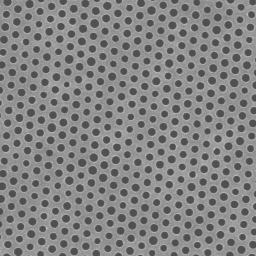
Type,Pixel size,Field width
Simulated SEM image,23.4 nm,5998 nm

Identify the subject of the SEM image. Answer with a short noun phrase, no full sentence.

a regular array of holes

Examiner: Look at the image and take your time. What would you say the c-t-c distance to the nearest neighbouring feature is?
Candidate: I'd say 0.294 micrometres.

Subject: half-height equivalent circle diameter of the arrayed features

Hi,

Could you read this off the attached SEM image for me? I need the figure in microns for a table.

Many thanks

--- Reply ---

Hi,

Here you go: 0.179